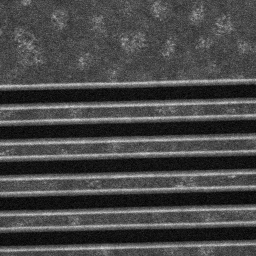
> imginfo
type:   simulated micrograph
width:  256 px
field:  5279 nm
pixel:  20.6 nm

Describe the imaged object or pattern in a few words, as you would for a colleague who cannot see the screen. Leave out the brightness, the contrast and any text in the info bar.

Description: parallel lines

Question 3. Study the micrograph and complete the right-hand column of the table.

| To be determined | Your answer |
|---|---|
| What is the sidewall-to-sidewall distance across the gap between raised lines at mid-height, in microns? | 0.368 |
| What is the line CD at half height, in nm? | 366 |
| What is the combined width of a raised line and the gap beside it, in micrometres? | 0.733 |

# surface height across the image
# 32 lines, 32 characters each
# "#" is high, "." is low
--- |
################################
################################
################################
################################
################################
################################
################################
################################
################################
################################
###################.............
................................
................................
################################
################################
................................
................................
..............##################
################################
###############.................
................................
...........................#####
################################
################################
................................
................................
.......#########################
################################
###########.....................
................................
........................########
################################